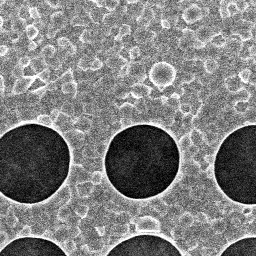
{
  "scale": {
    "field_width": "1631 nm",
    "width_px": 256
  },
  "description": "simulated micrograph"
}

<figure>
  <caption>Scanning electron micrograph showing holes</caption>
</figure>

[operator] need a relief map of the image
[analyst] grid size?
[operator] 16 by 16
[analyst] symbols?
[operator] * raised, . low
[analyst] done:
****************
****************
****************
****************
****************
****************
****************
****************
....***....***..
....***....***..
....***....**...
....***....***..
*..************.
****************
****************
....***....***..